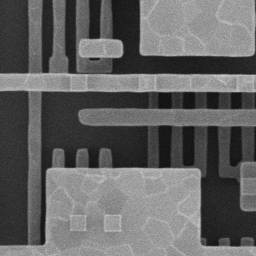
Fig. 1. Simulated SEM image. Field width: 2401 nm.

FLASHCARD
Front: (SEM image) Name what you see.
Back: wiring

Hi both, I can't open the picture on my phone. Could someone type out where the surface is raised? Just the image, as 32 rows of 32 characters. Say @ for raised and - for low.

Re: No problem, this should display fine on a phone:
-----------------@@@@@@@@@@@@@@@
------------------@@@@@@@@@@@@@@
------------------@@@@@@@@@@@@@@
------------------@@@@@@@@@@@@@@
------------------@@@@@@@@@@@@@@
----------@@@@@--@@@@@@@@@@@@@@@
----------@@@@@--@@@@@@@@@@@@@@@
--------------------------------
--------------------------------
@@@@@@@@@@@@@@@@@@@@@@@@@@@@@@@@
@@@@@@@@@@@@@@@@@@@@@@@@@@@@@@@@
--------------------------------
--------------------------------
--------------------------------
----------@@@@@@@@@@@@@@@@@@@@@@
----------@@@@@@@@@@@@@@@@@@@@@@
--------------------------------
--------------------------------
--------------------------------
--------------------------------
------------------------------@@
------@@@@@@@@@@@@@@@@@@@-----@@
------@@@@@@@@@@@@@@@@@@@-----@@
------@@@@@@@@@@@@@@@@@@@-----@@
------@@@@@@@@@@@@@@@@@@@-----@@
------@@@@@@@@@@@@@@@@@@@-----@@
------@@@@@@@@@@@@@@@@@@@-------
------@@@@@@@@@@@@@@@@@@@-------
------@@@@@@@@@@@@@@@@@@@-------
------@@@@@@@@@@@@@@@@@@@-------
-----@@@@@@@@@@@@@@@@@@@@-------
@@@@@@@@@@@@@@@@@@@@@@@@@@@@@@@@